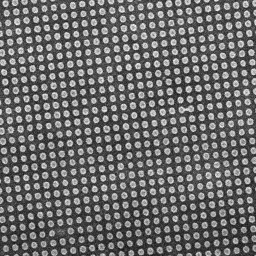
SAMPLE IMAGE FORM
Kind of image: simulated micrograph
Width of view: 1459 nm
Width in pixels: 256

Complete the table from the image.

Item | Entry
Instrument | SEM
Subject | a regular array of raised bodies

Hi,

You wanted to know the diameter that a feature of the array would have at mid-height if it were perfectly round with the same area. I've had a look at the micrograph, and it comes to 34.6 nm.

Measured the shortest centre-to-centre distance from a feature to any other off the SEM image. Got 53.5 nanometers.